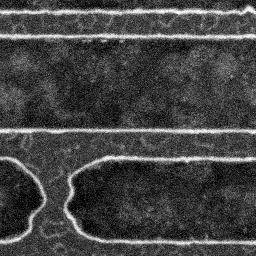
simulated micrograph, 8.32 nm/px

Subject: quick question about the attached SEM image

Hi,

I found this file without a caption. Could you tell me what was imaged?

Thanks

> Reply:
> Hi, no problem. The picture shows one or a few lines or trenches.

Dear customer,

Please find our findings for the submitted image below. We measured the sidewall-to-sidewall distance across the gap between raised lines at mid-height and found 776 nanometers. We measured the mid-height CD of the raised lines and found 0.214 µm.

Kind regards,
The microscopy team